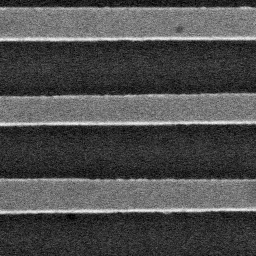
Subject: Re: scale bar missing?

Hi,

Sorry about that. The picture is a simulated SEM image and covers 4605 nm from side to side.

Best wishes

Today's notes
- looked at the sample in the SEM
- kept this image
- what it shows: lines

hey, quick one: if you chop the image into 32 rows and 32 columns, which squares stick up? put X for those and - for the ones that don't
--------------------------------
XXXXXXXXXXXXXXXXXXXXXXXXXXXXXXXX
XXXXXXXXXXXXXXXXXXXXXXXXXXXXXXXX
XXXXXXXXXXXXXXXXXXXXXXXXXXXXXXXX
XXXXXXXXXXXXXXXXXXXXXXXXXXXXXXXX
--------------------------------
--------------------------------
--------------------------------
--------------------------------
--------------------------------
--------------------------------
--------------------------------
XXXXXXXXXXXXXXXXXXXXXXXXXXXXXXXX
XXXXXXXXXXXXXXXXXXXXXXXXXXXXXXXX
XXXXXXXXXXXXXXXXXXXXXXXXXXXXXXXX
XXXXXXXXXXXXXXXXXXXXX-----------
--------------------------------
--------------------------------
--------------------------------
--------------------------------
--------------------------------
--------------------------------
XXXXXXXXXXXX--XXXXX-XX----X-----
XXXXXXXXXXXXXXXXXXXXXXXXXXXXXXXX
XXXXXXXXXXXXXXXXXXXXXXXXXXXXXXXX
XXXXXXXXXXXXXXXXXXXXXXXXXXXXXXXX
XXXXXXXXXXXXXX------------------
--------------------------------
--------------------------------
--------------------------------
--------------------------------
--------------------------------